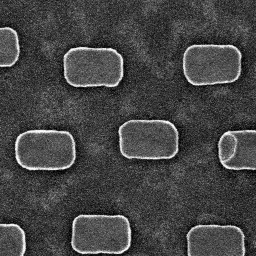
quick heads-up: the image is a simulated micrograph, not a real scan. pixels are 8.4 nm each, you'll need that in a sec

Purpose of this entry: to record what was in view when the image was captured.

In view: raised bodies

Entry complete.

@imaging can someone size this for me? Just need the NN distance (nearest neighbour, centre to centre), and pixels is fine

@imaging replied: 95.5